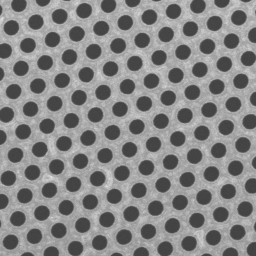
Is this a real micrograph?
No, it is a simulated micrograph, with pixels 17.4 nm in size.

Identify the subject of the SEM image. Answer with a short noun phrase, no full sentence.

a regular array of holes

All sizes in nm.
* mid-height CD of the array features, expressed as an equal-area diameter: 264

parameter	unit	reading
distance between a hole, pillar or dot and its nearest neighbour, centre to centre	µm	0.419